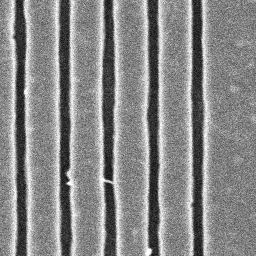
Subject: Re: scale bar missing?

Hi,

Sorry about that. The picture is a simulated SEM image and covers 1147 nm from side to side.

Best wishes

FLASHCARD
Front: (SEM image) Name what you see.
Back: parallel lines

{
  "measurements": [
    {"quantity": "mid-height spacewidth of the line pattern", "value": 47.6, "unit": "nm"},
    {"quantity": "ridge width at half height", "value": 149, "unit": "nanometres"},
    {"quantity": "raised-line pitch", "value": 198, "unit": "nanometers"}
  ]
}